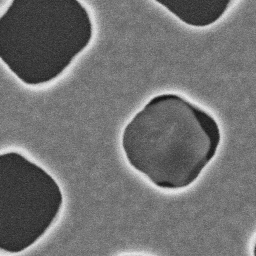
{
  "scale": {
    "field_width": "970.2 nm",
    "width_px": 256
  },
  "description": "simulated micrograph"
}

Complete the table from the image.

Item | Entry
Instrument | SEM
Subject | holes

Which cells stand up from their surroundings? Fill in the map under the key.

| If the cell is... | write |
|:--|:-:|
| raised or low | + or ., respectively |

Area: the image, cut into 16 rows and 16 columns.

+....+++++....++
......++++++.+++
......++++++++++
.....+++++++++++
+...++++++++++++
++++++++++++++++
+++++++++...++++
++++++++.....+++
++++++++......++
++++++++.....+++
..++++++.....+++
....++++++..++++
....++++++++++++
....++++++++++++
...+++++++++++++
..++++++++++++++